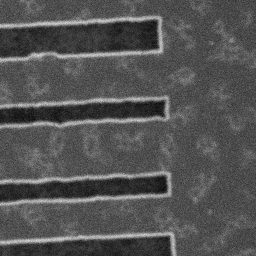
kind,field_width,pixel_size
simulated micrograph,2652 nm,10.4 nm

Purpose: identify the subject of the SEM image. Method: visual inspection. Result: one or a few lines or trenches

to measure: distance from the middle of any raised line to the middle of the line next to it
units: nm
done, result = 724